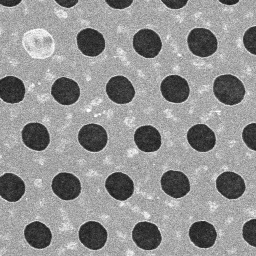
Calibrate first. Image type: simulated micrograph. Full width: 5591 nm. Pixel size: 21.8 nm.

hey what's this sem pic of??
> a regular array of holes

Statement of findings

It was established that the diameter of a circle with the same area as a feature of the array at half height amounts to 0.626 um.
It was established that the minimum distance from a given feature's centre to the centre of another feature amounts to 1170 nm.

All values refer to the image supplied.